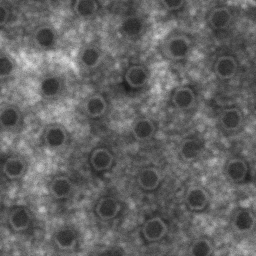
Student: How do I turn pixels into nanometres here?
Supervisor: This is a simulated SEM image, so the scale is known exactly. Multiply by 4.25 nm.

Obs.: a regular array of raised bodies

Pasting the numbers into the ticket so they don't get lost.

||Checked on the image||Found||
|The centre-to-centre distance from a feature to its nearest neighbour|0.212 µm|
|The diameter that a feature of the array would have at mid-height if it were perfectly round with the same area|90.4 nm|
